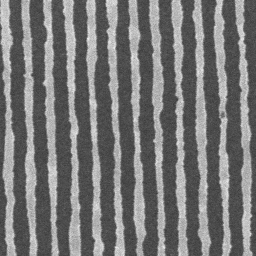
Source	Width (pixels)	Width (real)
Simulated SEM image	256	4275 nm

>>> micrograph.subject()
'parallel lines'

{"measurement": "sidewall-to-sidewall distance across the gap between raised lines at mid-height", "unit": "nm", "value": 240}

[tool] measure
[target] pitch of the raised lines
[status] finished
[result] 359 nanometers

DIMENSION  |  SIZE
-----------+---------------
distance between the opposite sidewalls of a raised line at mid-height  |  119 nm